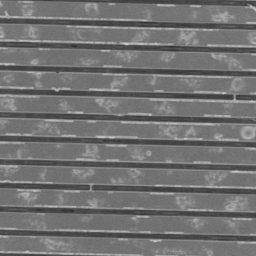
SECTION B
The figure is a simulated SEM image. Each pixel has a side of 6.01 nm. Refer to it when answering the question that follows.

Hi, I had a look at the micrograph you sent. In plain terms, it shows parallel lines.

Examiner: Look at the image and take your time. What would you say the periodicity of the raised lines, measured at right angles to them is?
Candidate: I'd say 141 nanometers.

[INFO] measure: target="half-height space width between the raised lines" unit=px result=6.12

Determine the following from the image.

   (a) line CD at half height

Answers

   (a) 0.104 microns